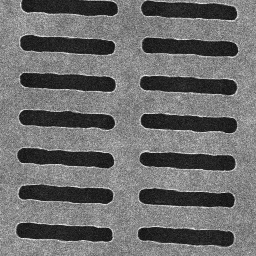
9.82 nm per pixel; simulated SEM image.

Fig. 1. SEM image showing a regular array of holes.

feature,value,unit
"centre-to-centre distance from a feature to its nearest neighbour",0.366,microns